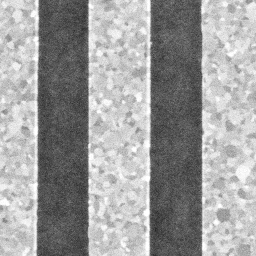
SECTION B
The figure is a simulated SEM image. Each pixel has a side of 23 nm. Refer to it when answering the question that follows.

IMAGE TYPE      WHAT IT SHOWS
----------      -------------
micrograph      lines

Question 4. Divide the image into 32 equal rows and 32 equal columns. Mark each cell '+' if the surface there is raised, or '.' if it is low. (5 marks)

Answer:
+++++......++++++++......+++++++
+++++......++++++++......+++++++
+++++......++++++++......+++++++
+++++......++++++++......+++++++
+++++......++++++++......+++++++
+++++......++++++++......+++++++
+++++......++++++++......+++++++
+++++......++++++++......+++++++
+++++......++++++++......+++++++
+++++......++++++++......+++++++
+++++......++++++++......+++++++
+++++......++++++++......+++++++
+++++......++++++++......+++++++
+++++......++++++++......+++++++
+++++......++++++++......+++++++
+++++......++++++++......+++++++
+++++......++++++++......+++++++
+++++......++++++++......+++++++
+++++......++++++++......+++++++
+++++......++++++++......+++++++
+++++......++++++++......+++++++
+++++......++++++++......+++++++
+++++......++++++++......+++++++
+++++......++++++++......+++++++
+++++......++++++++......+++++++
+++++......++++++++......+++++++
+++++......++++++++......+++++++
+++++......++++++++......+++++++
+++++......++++++++......+++++++
+++++......++++++++......+++++++
+++++......++++++++......+++++++
+++++......++++++++......+++++++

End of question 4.